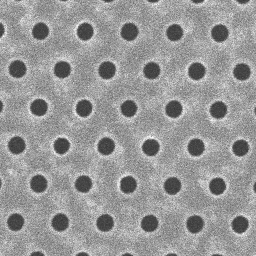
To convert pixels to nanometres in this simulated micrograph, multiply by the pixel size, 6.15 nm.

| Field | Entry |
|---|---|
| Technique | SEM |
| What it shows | a regular array of holes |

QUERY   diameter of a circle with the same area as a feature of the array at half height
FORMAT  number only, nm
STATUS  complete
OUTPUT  107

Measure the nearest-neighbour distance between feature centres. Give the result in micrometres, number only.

0.271